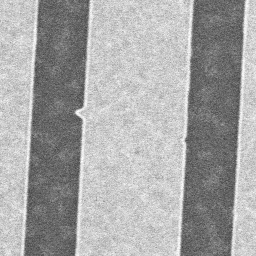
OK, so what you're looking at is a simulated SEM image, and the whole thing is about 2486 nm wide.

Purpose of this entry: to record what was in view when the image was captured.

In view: one or a few lines or trenches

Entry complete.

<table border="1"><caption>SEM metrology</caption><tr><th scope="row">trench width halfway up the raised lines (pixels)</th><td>54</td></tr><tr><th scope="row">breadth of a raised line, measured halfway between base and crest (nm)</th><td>980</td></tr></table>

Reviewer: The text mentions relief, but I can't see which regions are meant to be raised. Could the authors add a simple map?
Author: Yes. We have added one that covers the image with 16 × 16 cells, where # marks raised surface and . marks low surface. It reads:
##....######...#
##....######...#
##....######...#
##....######...#
##...#######...#
##...#######...#
##...#######...#
##...#######...#
##...#######...#
##...#######...#
##...######....#
##...######....#
##...######....#
##...######....#
##...######....#
#....######....#